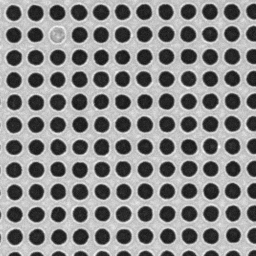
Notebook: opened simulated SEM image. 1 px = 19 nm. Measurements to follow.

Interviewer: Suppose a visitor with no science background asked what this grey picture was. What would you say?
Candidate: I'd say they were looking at a regular array of holes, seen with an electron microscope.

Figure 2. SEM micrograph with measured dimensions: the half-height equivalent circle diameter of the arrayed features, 0.312 µm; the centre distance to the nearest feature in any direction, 411 nanometres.